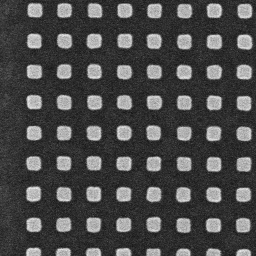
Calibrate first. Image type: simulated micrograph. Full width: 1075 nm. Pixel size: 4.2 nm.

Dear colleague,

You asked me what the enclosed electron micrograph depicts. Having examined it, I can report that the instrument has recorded a regular array of raised bodies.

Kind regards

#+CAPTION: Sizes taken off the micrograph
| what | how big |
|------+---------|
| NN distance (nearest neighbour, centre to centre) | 125 nm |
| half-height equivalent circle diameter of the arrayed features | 61.6 nm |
